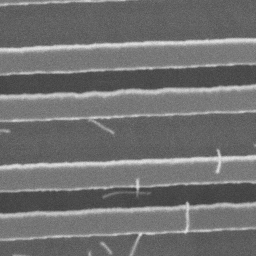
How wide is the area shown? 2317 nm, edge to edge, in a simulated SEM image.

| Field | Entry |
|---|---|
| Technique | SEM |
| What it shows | lines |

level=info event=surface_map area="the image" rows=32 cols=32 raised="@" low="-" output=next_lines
@@@@----------------------------
--------------------------------
--------------------------------
--------------------------------
--------------------------------
--------------@@@@@@@@@@@@@@@@@@
@@@@@@@@@@@@@@@@@@@@@@@@@@@@@@@@
@@@@@@@@@@@@@@@@@@@@@@@@@@@@@@@@
@@@@@@@@@@@@@@@@@@@@------------
--------------------------------
--------------------------------
--------------@@@@@@@@@@@@@@@@@@
@@@@@@@@@@@@@@@@@@@@@@@@@@@@@@@@
@@@@@@@@@@@@@@@@@@@@@@@@@@@@@@@@
@@@@@@@@@@@@@@@@@@--------------
--------------------------------
--------------------------------
--------------------------------
--------------------------------
--------------------------------
----@@-@@@@@@@@@@@@@@@@@@@@@@@@@
@@@@@@@@@@@@@@@@@@@@@@@@@@@@@@@@
@@@@@@@@@@@@@@@@@@@@@@@@@@@@@@@@
@@@@@@@@@@@@@@------------------
--------------------------------
----------------------------@-@@
----@@@@@@@@@@@@@@@@@@@@@@@@@@@@
@@@@@@@@@@@@@@@@@@@@@@@@@@@@@@@@
@@@@@@@@@@@@@@@@@@@@@@@@@@@@@@@@
@@@@@@@@@-----------------------
--------------------------------
--------------------------------